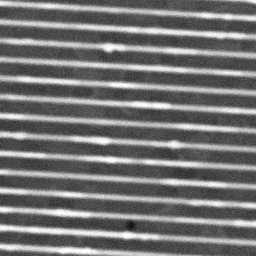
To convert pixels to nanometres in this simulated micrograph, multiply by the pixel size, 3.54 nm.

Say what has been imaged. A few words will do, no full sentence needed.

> parallel lines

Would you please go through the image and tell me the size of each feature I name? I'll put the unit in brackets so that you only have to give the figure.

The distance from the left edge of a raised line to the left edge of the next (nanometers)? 66.1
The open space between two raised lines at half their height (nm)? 54.8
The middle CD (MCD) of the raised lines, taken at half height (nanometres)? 10.6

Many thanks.